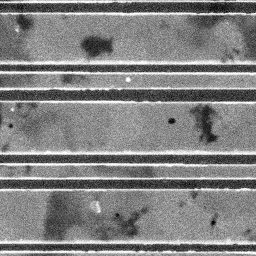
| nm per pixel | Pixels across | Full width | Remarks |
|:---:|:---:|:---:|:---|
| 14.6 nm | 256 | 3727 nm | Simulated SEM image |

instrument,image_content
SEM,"lines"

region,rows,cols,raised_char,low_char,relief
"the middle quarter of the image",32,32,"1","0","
00000000000000000000000000000000
00000000000000000000000000000000
11111111111111111111111111111111
11111111111111111111111111111111
11111111111111111111111111111111
11111111111111111111111111111111
00000000000000000000000000000000
00000000000000000000000000000000
00000000000000000000000000000000
11111111111111100000000000000000
11111111111111111111111111111111
11111111111111111111111111111111
11111111111111111111111111111111
11111111111111111111111111111111
11111111111111111111111111111111
11111111111111111111111111111111
11111111111111111111111111111111
11111111111111111111111111111111
11111111111111111111111111111111
11111111111111111111111111111111
11111111111111111111111111111111
11111111111111111111111111111111
00000000000000000000000000000000
00000000000000000000000000000000
00000000000000000000000000000000
11111111111111111111111111111111
11111111111111111111111111111111
11111111111111111111111111111111
11111111111111111111111111111111
00000000000000000000000000000000
00000000000000000000000000000000
11111111111111111111111111111111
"